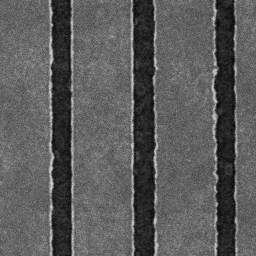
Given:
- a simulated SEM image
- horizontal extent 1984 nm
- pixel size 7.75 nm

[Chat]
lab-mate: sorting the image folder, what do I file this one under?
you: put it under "one or a few lines or trenches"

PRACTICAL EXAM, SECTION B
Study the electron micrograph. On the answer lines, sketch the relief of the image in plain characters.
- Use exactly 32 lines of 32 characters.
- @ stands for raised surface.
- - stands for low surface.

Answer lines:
@@@@@@---@@@@@@@@--@@@@@@@@--@@@
@@@@@@---@@@@@@@---@@@@@@@@--@@@
@@@@@@---@@@@@@@@--@@@@@@@@--@@@
@@@@@@---@@@@@@@@--@@@@@@@@--@@@
@@@@@@---@@@@@@@---@@@@@@@@--@@@
@@@@@@---@@@@@@@---@@@@@@@@--@@@
@@@@@@---@@@@@@@@--@@@@@@@@--@@@
@@@@@@---@@@@@@@@--@@@@@@@@--@@@
@@@@@@---@@@@@@@---@@@@@@@@--@@@
@@@@@@---@@@@@@@---@@@@@@@@--@@@
@@@@@@---@@@@@@@@--@@@@@@@@--@@@
@@@@@@---@@@@@@@@--@@@@@@@@--@@@
@@@@@@---@@@@@@@@--@@@@@@@@---@@
@@@@@@---@@@@@@@@--@@@@@@@@--@@@
@@@@@@---@@@@@@@@--@@@@@@@@--@@@
@@@@@@---@@@@@@@@--@@@@@@@@---@@
@@@@@@---@@@@@@@@--@@@@@@@@---@@
@@@@@@---@@@@@@@@--@@@@@@@@---@@
@@@@@@---@@@@@@@@--@@@@@@@@---@@
@@@@@@@--@@@@@@@@--@@@@@@@@---@@
@@@@@@---@@@@@@@@--@@@@@@@@--@@@
@@@@@@---@@@@@@@@---@@@@@@@--@@@
@@@@@@---@@@@@@@@---@@@@@@@--@@@
@@@@@@---@@@@@@@@--@@@@@@@@--@@@
@@@@@@---@@@@@@@@--@@@@@@@@--@@@
@@@@@@---@@@@@@@@--@@@@@@@@--@@@
@@@@@@---@@@@@@@@--@@@@@@@@---@@
@@@@@@---@@@@@@@@--@@@@@@@@--@@@
@@@@@@---@@@@@@@@--@@@@@@@@---@@
@@@@@@---@@@@@@@@--@@@@@@@@--@@@
@@@@@@---@@@@@@@@--@@@@@@@@--@@@
@@@@@@---@@@@@@@@---@@@@@@@---@@